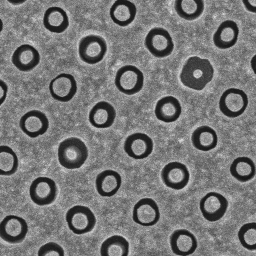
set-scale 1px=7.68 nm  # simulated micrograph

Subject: a regular array of ring-shaped grooves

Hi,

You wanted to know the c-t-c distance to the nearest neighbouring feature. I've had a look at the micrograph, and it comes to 353 nm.